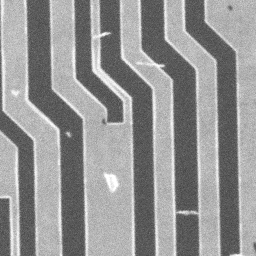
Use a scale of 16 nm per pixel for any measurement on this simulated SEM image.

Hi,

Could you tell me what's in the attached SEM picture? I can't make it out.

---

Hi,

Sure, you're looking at groups of lines, slits or small figures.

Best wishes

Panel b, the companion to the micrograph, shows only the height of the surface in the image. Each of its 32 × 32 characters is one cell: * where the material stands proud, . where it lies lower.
***...***..*...**....**...******
***...***..*...**....**...******
***...***..*...**....**...******
***...***..*...**....**...******
***...***..**..**....***...*****
***...***......**....****....***
***...***......***....****...***
***...***.......***....****...**
***...***........***....***...**
***...***...*.....***....**...**
***....***...*.....***...**...**
***....****...**...***...**...**
****....****...*...***...**...**
****.....****..*...***...**...**
.****.....***..*...***...**...**
..****.....*****...***...**...**
...****....*****...***...**...**
*...***....******..***...**...**
**..***....******..***...**...**
**..***....******..***...**...**
**..***....******..***...**...**
**..***....******..***...**...**
**..***....******..***...**...**
**..***....******..***...**...**
**..***....******...**...**...**
.*..***....******...**...**...**
.*..***....******...**...**...**
.*..****...******...**...**...**
.*...***...******...**...**...**
.....***...******...**...**...**
.....***...******...**...**...**
.....***...******...**...**...**